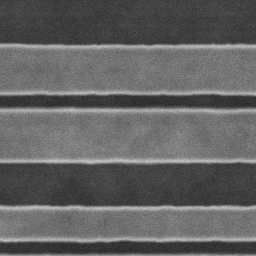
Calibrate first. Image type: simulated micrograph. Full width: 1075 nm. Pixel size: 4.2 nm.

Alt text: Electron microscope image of lines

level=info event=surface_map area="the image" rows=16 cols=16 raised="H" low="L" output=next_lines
LLLLLLLLLLLLLLLL
LLLLLLLLLLLLLLLL
LLLLLLLLLLLLLLLL
HHHHHHHHHHHHHHHH
HHHHHHHHHHHHHHHH
HHHHHHHHHHHHHHHH
HHHHHHHHHHHHHHHH
HHHHHHHHHHHHHHHH
HHHHHHHHHHHHHHHH
HHHHHHHHHHHHHHHH
LLLLLLLLLLLLLLLL
LLLLLLLLLLLLLLLL
LLLLLLLLLLLLLLLL
HHHHHHHHHHHHHHHH
HHHHHHHHHHHHHHHH
HHHHHHHHHHHHHHHH